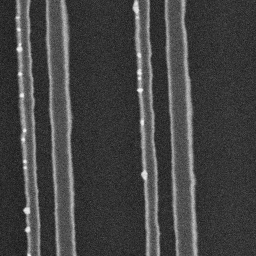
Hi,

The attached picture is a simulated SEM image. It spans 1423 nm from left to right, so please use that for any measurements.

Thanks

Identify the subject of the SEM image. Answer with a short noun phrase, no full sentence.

lines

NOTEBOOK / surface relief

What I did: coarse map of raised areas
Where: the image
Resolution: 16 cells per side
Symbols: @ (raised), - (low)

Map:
-@@@----@@@-----
-@@@-----@@-----
-@@@-----@@@----
-@@@-----@@@----
-@@@-----@@@----
-@@@-----@@@----
-@@@-----@@@----
-@@@-----@@@----
-@@@-----@@@----
--@@-----@@@----
--@@-----@@@----
--@@-----@@@----
--@@@----@@@----
--@@@----@@@----
--@@@----@@@----
--@@@----@@@----